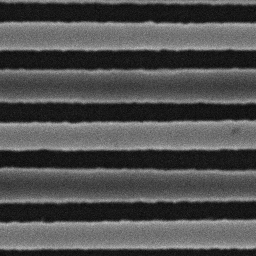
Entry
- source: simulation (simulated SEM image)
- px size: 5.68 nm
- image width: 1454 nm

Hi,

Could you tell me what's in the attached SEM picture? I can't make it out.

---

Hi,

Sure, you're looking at lines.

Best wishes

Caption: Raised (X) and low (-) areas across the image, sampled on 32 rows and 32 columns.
--------------------------------
--------------------------------
--------------------------------
XXXXXXXXXXXXXXXXXXXXXXXXXXXXXXXX
XXXXXXXXXXXXXXXXXXXXXXXXXXXXXXXX
XXXXXXXXXXXXXXXXXXXXXXXXXXXXXXXX
--------------------------------
--------------------------------
--------------------------------
XXXXXXXXXXXXXXXXXXXXXXXXXXXXXXXX
XXXXXXXXXXXXXXXXXXXXXXXXXXXXXXXX
XXXXXXXXXXXXXXXXXXXXXXXXXXXXXXXX
XXXXXXXXXXXXXXXXXXXXXXXXXXXXXXXX
--------------------------------
--------------------------------
XXXXXXXXXXXXXXXXXXXXXXXXXXXXXXXX
XXXXXXXXXXXXXXXXXXXXXXXXXXXXXXXX
XXXXXXXXXXXXXXXXXXXXXXXXXXXXXXXX
XXXXXXXXXXXXXXXXXXXXXXXXXXXXXXXX
--------------------------------
--------------------------------
XXXXXXXXXXXXXXXXXXXXXXXXXXXXXXXX
XXXXXXXXXXXXXXXXXXXXXXXXXXXXXXXX
XXXXXXXXXXXXXXXXXXXXXXXXXXXXXXXX
XXXXXXXXXXXXXXXXXXXXXXXXXXXXXXXX
--------------------------------
--------------------------------
----------------------------X--X
XXXXXXXXXXXXXXXXXXXXXXXXXXXXXXXX
XXXXXXXXXXXXXXXXXXXXXXXXXXXXXXXX
XXXXXXXXXXXXXXXXXXXXXXXXXXXXXXXX
--------------------------------